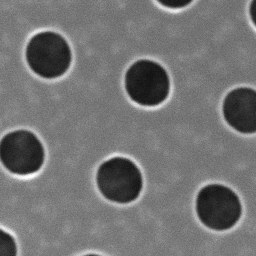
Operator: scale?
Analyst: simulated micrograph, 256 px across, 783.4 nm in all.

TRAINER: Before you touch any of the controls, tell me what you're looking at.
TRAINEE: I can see holes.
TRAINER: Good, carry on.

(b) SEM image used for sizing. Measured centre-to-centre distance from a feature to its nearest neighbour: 102 pixels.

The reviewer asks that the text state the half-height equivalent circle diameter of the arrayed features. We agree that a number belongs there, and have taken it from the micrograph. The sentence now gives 144 nanometers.